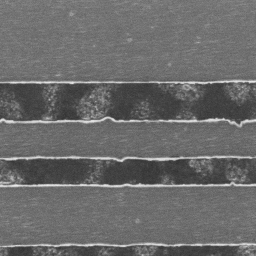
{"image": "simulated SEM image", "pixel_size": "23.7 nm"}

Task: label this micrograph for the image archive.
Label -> one or a few lines or trenches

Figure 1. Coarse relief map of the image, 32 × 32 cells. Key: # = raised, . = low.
................................
................................
................................
................................
................................
................................
................................
................................
................................
................................
################################
################################
################################
################################
################################
................................
................................
................................
................................
................................
################################
################################
################################
................................
................................
................................
................................
................................
................................
................................
................................
################################